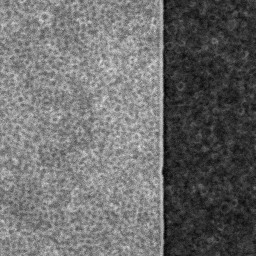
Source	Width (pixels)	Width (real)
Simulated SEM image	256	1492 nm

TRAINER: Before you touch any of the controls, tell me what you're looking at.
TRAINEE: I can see one or a few lines or trenches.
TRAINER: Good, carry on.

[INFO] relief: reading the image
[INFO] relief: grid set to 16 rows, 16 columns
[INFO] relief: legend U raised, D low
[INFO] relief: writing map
UUUUUUUUUUDDDDDD
UUUUUUUUUUDDDDDD
UUUUUUUUUUDDDDDD
UUUUUUUUUUDDDDDD
UUUUUUUUUUDDDDDD
UUUUUUUUUUDDDDDD
UUUUUUUUUUDDDDDD
UUUUUUUUUUDDDDDD
UUUUUUUUUUDDDDDD
UUUUUUUUUUDDDDDD
UUUUUUUUUUDDDDDD
UUUUUUUUUUDDDDDD
UUUUUUUUUUDDDDDD
UUUUUUUUUUDDDDDD
UUUUUUUUUUDDDDDD
UUUUUUUUUUDDDDDD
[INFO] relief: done